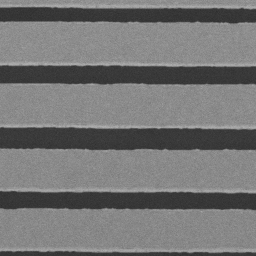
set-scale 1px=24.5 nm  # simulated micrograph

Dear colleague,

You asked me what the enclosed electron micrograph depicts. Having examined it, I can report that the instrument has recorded lines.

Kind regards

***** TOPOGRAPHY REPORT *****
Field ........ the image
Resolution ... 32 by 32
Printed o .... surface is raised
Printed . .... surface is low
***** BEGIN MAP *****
oooooooooooooooooooooooooooooooo
................................
................................
oooooooooooooooooooooooooooooooo
oooooooooooooooooooooooooooooooo
oooooooooooooooooooooooooooooooo
oooooooooooooooooooooooooooooooo
oooooooooooooooooooooooooooooooo
................................
................................
................................
oooooooooooooooooooooooooooooooo
oooooooooooooooooooooooooooooooo
oooooooooooooooooooooooooooooooo
oooooooooooooooooooooooooooooooo
oooooooooooooooooooooooooooooooo
................................
................................
................................
oooooooooooooooooooooooooooooooo
oooooooooooooooooooooooooooooooo
oooooooooooooooooooooooooooooooo
oooooooooooooooooooooooooooooooo
oooooooooooooooooooooooooooooooo
................................
................................
oooooooooooooooooooooooooooooooo
oooooooooooooooooooooooooooooooo
oooooooooooooooooooooooooooooooo
oooooooooooooooooooooooooooooooo
oooooooooooooooooooooooooooooooo
................................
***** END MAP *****